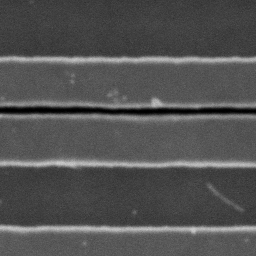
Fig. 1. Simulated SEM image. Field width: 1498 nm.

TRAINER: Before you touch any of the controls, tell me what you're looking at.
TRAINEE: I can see lines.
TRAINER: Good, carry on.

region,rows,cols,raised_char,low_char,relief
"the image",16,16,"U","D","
DDDDDDDDDDDDDDDD
DDDDDDDDDDDDDDDD
DDDDDDDDDDDDDDDD
DDDDDDDDDDDDDDDD
UUUUUUUUUUUUUUUU
UUUUUUUUUUUUUUUU
UUUUUUUUUUUUUUUU
UUUUUUUUUUUUUUUU
UUUUUUUUUUUUUUUU
UUUUUUUUUUUUUUUU
DDDDDDDDDDDDDDDD
DDDDDDDDDDDDDDDD
DDDDDDDDDDDDDDDD
DDDDDDDDDDDDDDDD
UUUUUUUUUUUUUUUU
UUUUUUUUUUUUUUUU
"